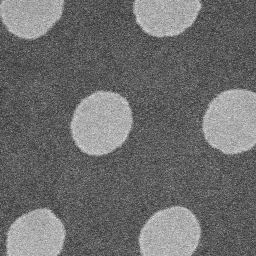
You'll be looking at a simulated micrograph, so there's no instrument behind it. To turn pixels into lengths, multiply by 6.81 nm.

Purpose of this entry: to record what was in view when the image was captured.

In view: raised bodies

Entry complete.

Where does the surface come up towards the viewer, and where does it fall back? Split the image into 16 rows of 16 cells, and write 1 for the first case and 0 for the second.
1111000011110000
1110000001110000
0000000000000000
0000000000000000
0000000000000000
0000000000000000
0000011100000111
0000011100000111
0000011100000111
0000011000000010
0000000000000000
0000000000000000
0000000000000000
0110000000110000
0111000001110000
1111000001110000